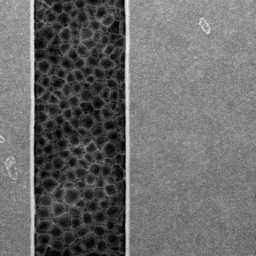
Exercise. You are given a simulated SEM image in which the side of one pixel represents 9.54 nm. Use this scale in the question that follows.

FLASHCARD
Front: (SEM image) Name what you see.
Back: one or a few lines or trenches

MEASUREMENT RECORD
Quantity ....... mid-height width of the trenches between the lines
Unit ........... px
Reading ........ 94.3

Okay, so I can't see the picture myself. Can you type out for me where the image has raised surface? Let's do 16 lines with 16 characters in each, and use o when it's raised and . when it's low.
oo......oooooooo
oo......oooooooo
oo......oooooooo
oo......oooooooo
oo......oooooooo
oo......oooooooo
oo......oooooooo
oo......oooooooo
oo......oooooooo
oo......oooooooo
oo......oooooooo
oo......oooooooo
oo......oooooooo
oo......oooooooo
oo......oooooooo
oo......oooooooo